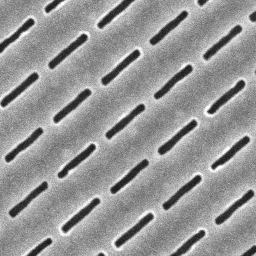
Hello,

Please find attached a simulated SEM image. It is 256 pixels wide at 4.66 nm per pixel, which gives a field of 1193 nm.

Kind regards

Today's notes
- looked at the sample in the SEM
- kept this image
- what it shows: a regular array of holes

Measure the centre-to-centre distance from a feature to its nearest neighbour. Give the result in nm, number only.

254